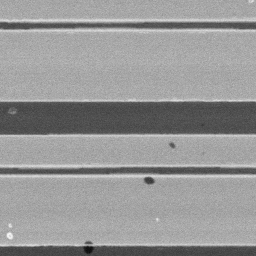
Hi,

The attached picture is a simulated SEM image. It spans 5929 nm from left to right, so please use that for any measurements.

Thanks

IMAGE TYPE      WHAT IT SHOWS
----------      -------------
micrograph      lines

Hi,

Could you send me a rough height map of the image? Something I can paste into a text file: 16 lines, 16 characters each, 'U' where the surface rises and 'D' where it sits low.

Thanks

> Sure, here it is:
UUUUUUUUUUUUUUUU
UUUUUUUUUUUUUUUU
UUUUUUUUUUUUUUUU
UUUUUUUUUUUUUUUU
UUUUUUUUUUUUUUUU
UUUUUUUUUUUUUUUU
DDDDDDDDDDDDDDDD
DDDDDDDDDDDDDDDD
UUUUUUUUUUUUUUUU
UUUUUUUUUUUUUUUU
UUUUUUUUUUUUUUUU
UUUUUUUUUUUUUUUU
UUUUUUUUUUUUUUUU
UUUUUUUUUUUUUUUU
UUUUUUUUUUUUUUUU
DDDDDDDDDDDDDDDD